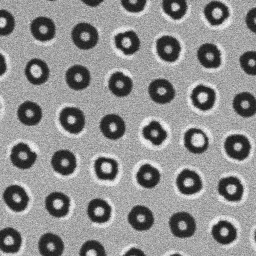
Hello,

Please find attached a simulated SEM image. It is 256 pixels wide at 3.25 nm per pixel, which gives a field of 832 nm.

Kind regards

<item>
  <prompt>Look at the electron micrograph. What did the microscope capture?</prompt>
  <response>a regular array of ring-shaped grooves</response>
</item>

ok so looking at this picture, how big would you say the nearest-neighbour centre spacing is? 135 nanometers